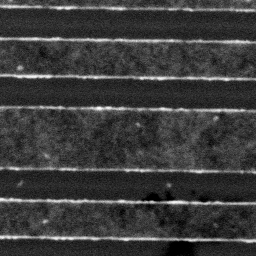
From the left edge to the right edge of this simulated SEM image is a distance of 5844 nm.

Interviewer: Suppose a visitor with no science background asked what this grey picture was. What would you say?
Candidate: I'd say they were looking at lines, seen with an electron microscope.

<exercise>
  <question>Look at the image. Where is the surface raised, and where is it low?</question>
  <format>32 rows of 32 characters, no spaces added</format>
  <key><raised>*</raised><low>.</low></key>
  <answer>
********************************
................................
................................
................................
................................
********************************
********************************
********************************
********************************
.*******************************
................................
................................
................................
*******.........................
********************************
********************************
********************************
********************************
********************************
********************************
********************************
................................
................................
................................
................................
********************************
********************************
********************************
********************************
********************************
................................
................................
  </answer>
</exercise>